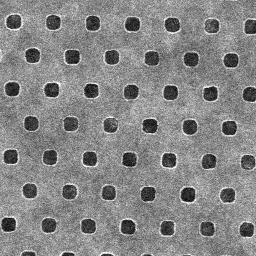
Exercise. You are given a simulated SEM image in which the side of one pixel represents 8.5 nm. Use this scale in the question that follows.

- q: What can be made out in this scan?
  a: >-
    a regular array of holes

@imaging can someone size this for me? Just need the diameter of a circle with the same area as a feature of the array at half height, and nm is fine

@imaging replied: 138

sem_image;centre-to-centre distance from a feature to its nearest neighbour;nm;331